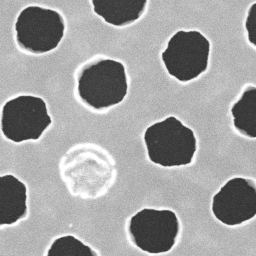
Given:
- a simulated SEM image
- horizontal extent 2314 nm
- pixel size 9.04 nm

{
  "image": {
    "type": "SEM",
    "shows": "holes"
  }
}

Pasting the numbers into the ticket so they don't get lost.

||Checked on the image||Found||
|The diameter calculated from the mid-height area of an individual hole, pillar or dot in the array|0.438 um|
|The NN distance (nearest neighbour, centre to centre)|787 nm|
